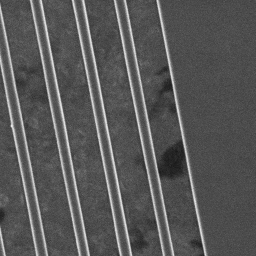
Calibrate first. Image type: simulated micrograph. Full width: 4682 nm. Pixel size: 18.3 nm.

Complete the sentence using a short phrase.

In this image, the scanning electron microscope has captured parallel lines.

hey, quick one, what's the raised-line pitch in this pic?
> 41.2 px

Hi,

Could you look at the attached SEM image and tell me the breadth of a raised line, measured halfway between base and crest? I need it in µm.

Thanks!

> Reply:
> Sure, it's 0.198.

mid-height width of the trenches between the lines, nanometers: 562